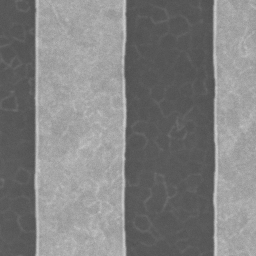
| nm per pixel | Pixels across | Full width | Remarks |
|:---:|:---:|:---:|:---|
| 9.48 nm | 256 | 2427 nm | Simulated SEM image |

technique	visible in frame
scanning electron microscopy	one or a few lines or trenches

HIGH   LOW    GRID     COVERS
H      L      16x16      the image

LLHHHHHHLLLLLHHH
LLHHHHHHLLLLLHHH
LLHHHHHHLLLLLHHH
LLHHHHHHLLLLLHHH
LLHHHHHHLLLLLHHH
LLHHHHHHLLLLLLHH
LLHHHHHHLLLLLHHH
LLHHHHHHLLLLLHHH
LLHHHHHHLLLLLLHH
LLHHHHHHLLLLLLHH
LLHHHHHHLLLLLLHH
LLHHHHHHLLLLLLHH
LLHHHHHHLLLLLHHH
LLHHHHHHLLLLLLHH
LLHHHHHHLLLLLHHH
LLHHHHHHLLLLLLHH